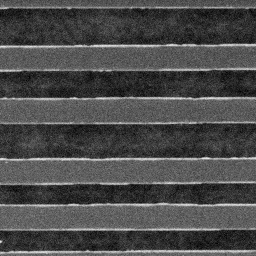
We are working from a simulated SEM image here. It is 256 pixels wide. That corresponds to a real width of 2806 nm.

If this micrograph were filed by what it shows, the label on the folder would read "lines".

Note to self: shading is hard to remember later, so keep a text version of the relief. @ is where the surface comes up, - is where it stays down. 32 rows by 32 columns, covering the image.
@@@@@@@@@@@@@@@@@@@@@@@@@@@@@@@@
--------------------------------
--------------------------------
--------------------------------
--------------------------------
--------------------------------
@@@@@@@@@@@@@@@@@@@@@@@@@@@@@@@@
@@@@@@@@@@@@@@@@@@@@@@@@@@@@@@@@
@@@@@@@@@@@@@@@@@@@@@@@@@@@@@@@@
--------------------------------
--------------------------------
--------------------------------
@@@@@@@@@@@@@@@@@@@@@@@@@@@@@@@@
@@@@@@@@@@@@@@@@@@@@@@@@@@@@@@@@
@@@@@@@@@@@@@@@@@@@@@@@@@@@@@@@@
--------------------------------
--------------------------------
--------------------------------
--------------------------------
--------------------------------
@@@@@@@@@@@@@@@@@@@@@@@@@@@@@@@@
@@@@@@@@@@@@@@@@@@@@@@@@@@@@@@@@
@@@@@@@@@@@@@@@@@@@@@@@@@@@@@@@@
--------------------------------
--------------------------------
--------------------@-----------
@@@@@@@@@@@@@@@@@@@@@@@@@@@@@@@@
@@@@@@@@@@@@@@@@@@@@@@@@@@@@@@@@
@@@@@@@@@@@@@@@@@@@@@@@@@@@@@@@@
--------------------------------
--------------------------------
--@@@@@@@@@@@@@@@@@@@@@@@@@@@@@@